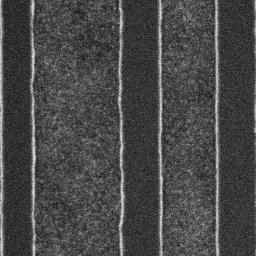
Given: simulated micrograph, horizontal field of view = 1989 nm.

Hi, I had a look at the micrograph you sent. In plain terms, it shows one or a few lines or trenches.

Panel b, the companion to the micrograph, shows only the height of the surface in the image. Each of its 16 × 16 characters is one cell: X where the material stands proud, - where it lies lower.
XX------XX----XX
XX------XX----XX
XX------XX----XX
XX-----XXX----XX
XX-----XXX----XX
XX-----XXX----XX
XX-----XXX----XX
XX------XX----XX
XX------XX----XX
XX------XX----XX
XX------XX----XX
XX------XX----XX
XX------XX----XX
XX------XX----XX
XX------XX----XX
XX------XX----XX